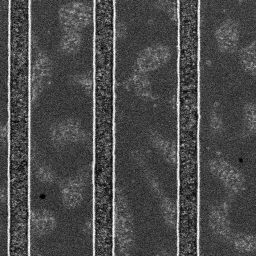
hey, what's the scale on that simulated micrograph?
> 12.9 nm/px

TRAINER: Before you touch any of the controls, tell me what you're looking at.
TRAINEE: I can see one or a few lines or trenches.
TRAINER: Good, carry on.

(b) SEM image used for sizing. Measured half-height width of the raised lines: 259 nanometres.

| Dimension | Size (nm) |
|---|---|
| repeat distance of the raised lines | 1090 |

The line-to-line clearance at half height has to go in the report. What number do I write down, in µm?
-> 0.835